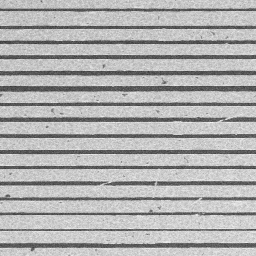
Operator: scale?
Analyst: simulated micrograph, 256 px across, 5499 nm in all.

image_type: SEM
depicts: parallel lines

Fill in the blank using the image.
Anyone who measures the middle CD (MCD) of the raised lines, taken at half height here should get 11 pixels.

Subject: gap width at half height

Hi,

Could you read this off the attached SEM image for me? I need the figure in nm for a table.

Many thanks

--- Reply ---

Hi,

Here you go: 85.9